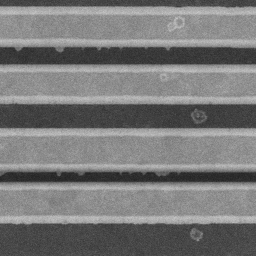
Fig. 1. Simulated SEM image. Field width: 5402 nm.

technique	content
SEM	lines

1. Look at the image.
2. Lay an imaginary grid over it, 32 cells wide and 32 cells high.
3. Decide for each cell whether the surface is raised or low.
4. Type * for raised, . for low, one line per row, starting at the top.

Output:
................................
********************************
********************************
********************************
********************************
..****....**********************
................................
................................
********************************
********************************
********************************
********************************
********************************
................................
................................
................................
********************************
********************************
********************************
********************************
********************************
................................
................................
********************************
********************************
********************************
********************************
********************************
................................
................................
................................
................................